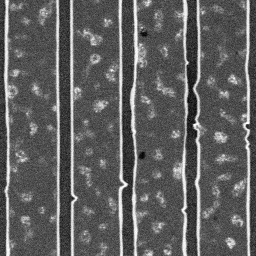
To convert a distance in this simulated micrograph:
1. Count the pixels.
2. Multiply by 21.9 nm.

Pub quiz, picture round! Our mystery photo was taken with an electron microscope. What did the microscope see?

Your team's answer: one or a few lines or trenches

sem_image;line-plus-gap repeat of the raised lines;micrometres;1.39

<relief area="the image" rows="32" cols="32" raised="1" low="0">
01111110011111100111111001111110
01111110011111100111111001111110
01111110011111100111111001111110
01111110011111100111111001111110
01111110011111100111111001111110
01111110011111100111111001111110
01111110011111100111111001111110
01111110011111100111111001111110
01111110011111100111111001111110
01111110011111100111111001111110
01111110011111100111111001111110
01111110011111100111111011111110
01111110011111100111111001111110
01111110011111100111111001111110
01111110011111100111111001111110
01111110011111100111111011111110
01111110011111100111111001111110
01111110011111100111111001111110
01111110011111100111111001111110
01111110011111100111111001111110
01111110011111100111111001111110
01111110011111100111111001111110
01111110011111100111111001111110
01111110011111100111111001111110
01111110011111100111111001111110
01111110011111100111111001111110
01111110011111100111111001111110
01111110011111100111111001111110
01111110011111100111111001111110
01111110011111100111111001111110
01111110011111100111111001111110
01111110011111100111111001111110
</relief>